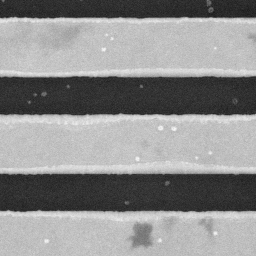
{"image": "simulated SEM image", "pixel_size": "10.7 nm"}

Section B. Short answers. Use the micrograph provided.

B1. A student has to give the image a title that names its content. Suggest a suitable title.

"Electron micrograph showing lines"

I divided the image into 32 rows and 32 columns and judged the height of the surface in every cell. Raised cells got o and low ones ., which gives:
................................
................................
oooooooooooooooooooooooooooooooo
oooooooooooooooooooooooooooooooo
oooooooooooooooooooooooooooooooo
oooooooooooooooooooooooooooooooo
oooooooooooooooooooooooooooooooo
oooooooooooooooooooooooooooooooo
oooooooooooooooooooooooooooooooo
................................
................................
................................
................................
................................
ooooooooo.oooooooooooooooooooooo
oooooooooooooooooooooooooooooooo
oooooooooooooooooooooooooooooooo
oooooooooooooooooooooooooooooooo
oooooooooooooooooooooooooooooooo
oooooooooooooooooooooooooooooooo
oooooooooooooooooooooooooooooooo
ooooooooooooooooo..........ooooo
................................
................................
................................
................................
oo.ooooooooo.......ooo....oooo.o
oooooooooooooooooooooooooooooooo
oooooooooooooooooooooooooooooooo
oooooooooooooooooooooooooooooooo
oooooooooooooooooooooooooooooooo
oooooooooooooooooooooooooooooooo